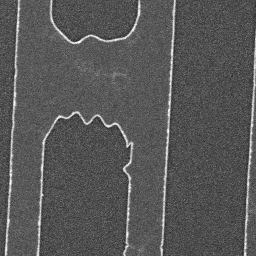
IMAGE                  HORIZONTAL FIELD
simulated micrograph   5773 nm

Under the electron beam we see one or a few lines or trenches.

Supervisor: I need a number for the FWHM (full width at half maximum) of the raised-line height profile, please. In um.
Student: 0.802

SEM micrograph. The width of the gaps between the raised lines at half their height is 1880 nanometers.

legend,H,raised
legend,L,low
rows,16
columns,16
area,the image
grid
LHHLLLLLLHHLLLLL
LHHLLLLLHHHLLLLL
LHHHLHHHHHHLLLLL
LHHHHHHHHHHLLLLL
LHHHHHHHHHHLLLLL
LHHHHHHHHHHLLLLL
LHHHHHHHHHHLLLLL
LHHHLHHHHHHLLLLL
LHHLLLLLHHLLLLLL
LHHLLLLLHHLLLLLL
LHHLLLLLHHLLLLLL
LHHLLLLLHHLLLLLH
LHHLLLLLHHLLLLLH
LHLLLLLLHHLLLLLH
HHLLLLLLHHLLLLLH
HHLLLLLLHHLLLLLH